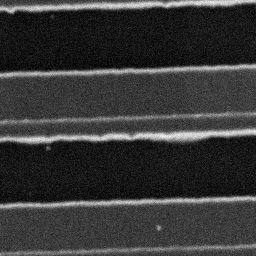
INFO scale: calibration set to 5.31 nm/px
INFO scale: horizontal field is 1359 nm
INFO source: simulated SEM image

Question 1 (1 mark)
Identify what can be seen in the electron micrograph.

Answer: lines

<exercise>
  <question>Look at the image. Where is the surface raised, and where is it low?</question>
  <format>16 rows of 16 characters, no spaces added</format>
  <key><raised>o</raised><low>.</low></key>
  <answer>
o...............
................
................
................
......oooooooooo
oooooooooooooooo
oooooooooooooooo
oooooooooooooooo
ooooooo.o.o.....
................
................
................
.............ooo
oooooooooooooooo
oooooooooooooooo
oooooooooooooooo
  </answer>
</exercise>